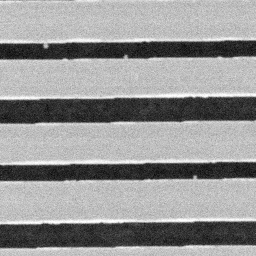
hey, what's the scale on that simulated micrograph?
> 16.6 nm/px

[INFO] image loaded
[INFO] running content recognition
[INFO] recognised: lines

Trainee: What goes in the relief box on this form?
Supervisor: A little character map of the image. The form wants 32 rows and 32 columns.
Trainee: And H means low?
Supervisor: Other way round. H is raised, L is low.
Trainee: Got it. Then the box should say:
HHHHHHHHHHHHHHHHHHHHHHHHHHHHHHHH
HHHHHHHHHHHHHHHHHHHHHHHHHHHHHHHH
HHHHHHHHHHHHHHHHHHHHHHHHHHHHHHHH
HHHHHHHHHHHHHHHHHHHHHHHHHHHHHHHH
HHHHHHHHHHHHHHHHHHHHHHHHHHHHHHHH
LLLLLLLLLLLLLLLLLLLLLLLLLLLLLLLL
LLLLLLLLLLLLLLLLLLLLLLLLLLLLLLLL
LLLLLLLLHHHHHHHHHHHHHHHHHHHHHHHH
HHHHHHHHHHHHHHHHHHHHHHHHHHHHHHHH
HHHHHHHHHHHHHHHHHHHHHHHHHHHHHHHH
HHHHHHHHHHHHHHHHHHHHHHHHHHHHHHHH
HHHHHHHHHHHHHHHHHHHHHHHHHHHHHHHH
LLLLLLLLLLLLLLLLLLLLLLLLLLLLLLLL
LLLLLLLLLLLLLLLLLLLLLLLLLLLLLLLL
LLLLLLLLLLLLLLLLLLLLLLLLLLLLLLLL
LLLLHHHHHHHHHHHHHHHHHHHHHHHHHHHH
HHHHHHHHHHHHHHHHHHHHHHHHHHHHHHHH
HHHHHHHHHHHHHHHHHHHHHHHHHHHHHHHH
HHHHHHHHHHHHHHHHHHHHHHHHHHHHHHHH
HHHHHHHHHHHHHHHHHHHHHHHHHHHHHHHH
HHLLLLLLLLLLLLLLLLLLLLLLLLLLLLLL
LLLLLLLLLLLLLLLLLLLLLLLLLLLLLLLL
LLLLLLLLLLLLLLLLLLLLLLLLLLLHHHHH
HHHHHHHHHHHHHHHHHHHHHHHHHHHHHHHH
HHHHHHHHHHHHHHHHHHHHHHHHHHHHHHHH
HHHHHHHHHHHHHHHHHHHHHHHHHHHHHHHH
HHHHHHHHHHHHHHHHHHHHHHHHHHHHHHHH
HHHHHHHHHHHHHHHHHHHHHHHHHLLLLLLL
LLLLLLLLLLLLLLLLLLLLLLLLLLLLLLLL
LLLLLLLLLLLLLLLLLLLLLLLLLLLLLLLL
LLLLLLLLLLLLLLLLLLLLLLLLLLLLLLLL
HHHHHHHHHHHHHHHHHHHHHHHHHHHHHHHH